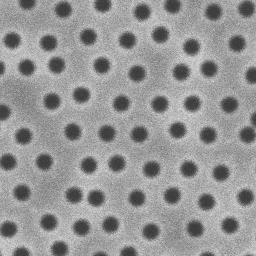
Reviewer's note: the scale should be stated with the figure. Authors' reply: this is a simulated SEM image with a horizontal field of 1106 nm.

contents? a regular array of holes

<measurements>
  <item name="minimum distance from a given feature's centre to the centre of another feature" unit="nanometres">135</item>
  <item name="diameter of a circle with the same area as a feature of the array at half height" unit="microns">0.0742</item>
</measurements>